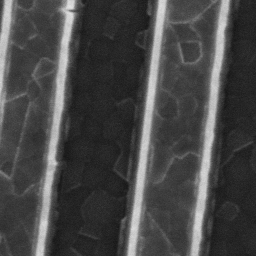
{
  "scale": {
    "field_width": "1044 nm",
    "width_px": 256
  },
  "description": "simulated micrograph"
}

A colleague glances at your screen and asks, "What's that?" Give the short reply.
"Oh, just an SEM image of one or a few lines or trenches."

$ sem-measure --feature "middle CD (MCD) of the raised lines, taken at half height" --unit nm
259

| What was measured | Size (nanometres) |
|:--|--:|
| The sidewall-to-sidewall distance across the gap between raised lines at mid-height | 369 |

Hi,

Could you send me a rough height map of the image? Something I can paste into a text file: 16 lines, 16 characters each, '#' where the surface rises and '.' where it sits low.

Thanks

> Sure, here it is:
####......####..
####......####..
####......####..
####......####..
####......####..
####.....####...
####.....####...
####.....####...
###......####...
###......####...
###......####...
###......####...
###......####...
###.....####....
###.....####....
###.....####....